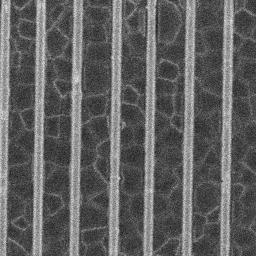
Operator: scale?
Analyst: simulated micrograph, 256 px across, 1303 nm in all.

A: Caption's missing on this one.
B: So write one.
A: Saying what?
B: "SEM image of parallel lines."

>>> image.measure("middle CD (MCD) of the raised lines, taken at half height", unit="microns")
0.0356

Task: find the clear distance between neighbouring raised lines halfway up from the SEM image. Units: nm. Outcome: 154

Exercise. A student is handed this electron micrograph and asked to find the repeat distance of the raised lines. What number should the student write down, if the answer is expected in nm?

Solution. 190